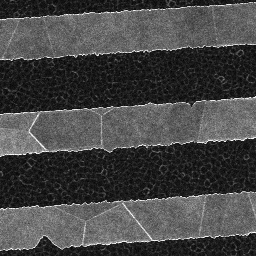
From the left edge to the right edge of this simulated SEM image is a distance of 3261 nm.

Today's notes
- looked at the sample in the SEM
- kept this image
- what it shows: one or a few lines or trenches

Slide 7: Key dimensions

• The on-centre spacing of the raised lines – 1210 nm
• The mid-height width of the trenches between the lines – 682 nm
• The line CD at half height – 0.528 µm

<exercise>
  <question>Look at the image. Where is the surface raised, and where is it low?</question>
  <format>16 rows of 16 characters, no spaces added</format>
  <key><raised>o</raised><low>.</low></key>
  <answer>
...........ooooo
oooooooooooooooo
oooooooooooooooo
oooo............
................
................
..........oooooo
oooooooooooooooo
oooooooooooooooo
ooo.............
................
................
.........ooooooo
oooooooooooooooo
oooooooooooooooo
oo..............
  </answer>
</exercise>